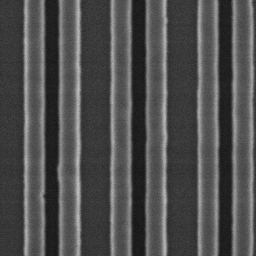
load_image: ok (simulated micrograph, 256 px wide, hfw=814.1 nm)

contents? parallel lines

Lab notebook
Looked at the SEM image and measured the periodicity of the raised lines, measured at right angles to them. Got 0.132 µm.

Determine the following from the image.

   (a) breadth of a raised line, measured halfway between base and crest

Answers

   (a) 19.6 px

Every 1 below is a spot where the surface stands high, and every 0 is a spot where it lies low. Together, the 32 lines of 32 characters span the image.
00011001110000110011100001100110
00011001110000110011100001100110
00011001110000110011100001100111
00011001110000110011100001100111
00011001110000110011100001100111
00011001110000110011100001100111
00011001110000110011100001100111
00011001110000110011100001100111
00011001110000110011100001100111
00011001110000110011100001100111
00011001110000110011100001100111
00011001110000110011100001100111
00011001110000110011100001100110
00011001110000110011100001100111
00011001110000110011100001100111
00011001110000110011100001100111
00011001110000110011100001100111
00011001110000110011100001100111
00011001110000110011100001100111
00011001110000110011100001100111
00011001110000110011100001100111
00011001110000110011100001100111
00011001110000110011100001100111
00011001110000110011100001100110
00011001110000110011100001100111
00011001110000110011100001100111
00011001110000110011100001100111
00011101110000110011100001100111
00011001110000110011100001100111
00011001110000110011100001100111
00011001110000110011100001100111
00011001110000110011100001100110